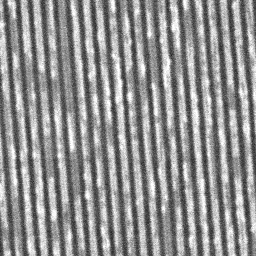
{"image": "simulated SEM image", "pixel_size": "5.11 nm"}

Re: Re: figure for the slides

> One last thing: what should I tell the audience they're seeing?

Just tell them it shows parallel lines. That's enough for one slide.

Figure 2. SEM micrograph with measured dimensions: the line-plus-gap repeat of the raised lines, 63.6 nm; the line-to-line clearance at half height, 36.3 nm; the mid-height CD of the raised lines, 27.4 nanometres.